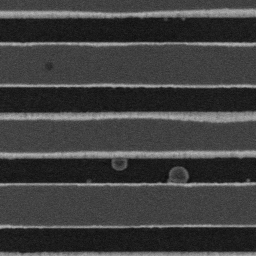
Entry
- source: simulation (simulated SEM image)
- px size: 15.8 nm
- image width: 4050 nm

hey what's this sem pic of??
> lines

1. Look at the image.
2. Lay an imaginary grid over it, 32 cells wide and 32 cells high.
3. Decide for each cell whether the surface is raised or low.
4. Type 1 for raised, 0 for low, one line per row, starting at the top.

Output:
11111111111111111111111111111111
11111111111111111111111111111111
00000000000000000000000000000000
00000000000000000000000000000000
00000000000000000000000000000000
11111111111111111111111111111111
11111111111111111111111111111111
11111111111111111111111111111111
11111111111111111111111111111111
11111111111111111111111111111111
11111111111111111111111111111111
00000000000000000000000000000000
00000000000000000000000000000000
00000000000000000000000000000000
11111111111111111111111111111111
11111111111111111111111111111111
11111111111111111111111111111111
11111111111111111111111111111111
11111111111111111111111111111111
01111100000000000000000000000000
00000000000000000000000000000000
00000000000000000000000000000000
00000000000000000000000000000000
11111111111111111111111111111111
11111111111111111111111111111111
11111111111111111111111111111111
11111111111111111111111111111111
11111111111111111111111111111111
00000000000000000000000000000000
00000000000000000000000000000000
00000000000000000000000000000000
00000000000000000000000000000000